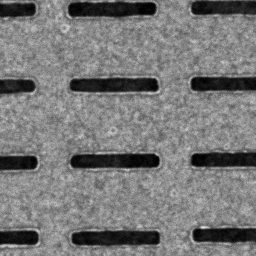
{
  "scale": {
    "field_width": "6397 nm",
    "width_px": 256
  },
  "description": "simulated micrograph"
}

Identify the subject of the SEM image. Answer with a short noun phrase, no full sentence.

holes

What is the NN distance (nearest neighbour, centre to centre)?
1900 nm